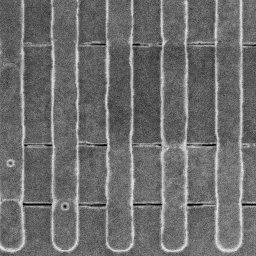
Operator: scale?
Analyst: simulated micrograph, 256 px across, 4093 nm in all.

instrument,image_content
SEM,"wiring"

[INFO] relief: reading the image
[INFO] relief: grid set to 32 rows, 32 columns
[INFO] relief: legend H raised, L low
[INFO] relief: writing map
HHHLLLLHHHLLLHHHLLLLHHHLLLLHHHLL
HHHLLLLHHHLLLHHHHLLLHHHLLLLHHHLL
HHHLLLLHHHLLLHHHHLLLHHHLLLLHHHLL
HHHLLLLHHHLLLHHHHLLLHHHLLLLHHHLL
HHHLLLLHHHLLLHHHLLLLHHHLLLLHHHLL
HHHLLLLHHHLLLHHHLLLLHHHLLLLHHHLL
HHHLLLLHHHLLLHHHLLLLHHHLLLLHHHLL
HHHLLLLHHHLLLHHHLLLLHHHLLLLHHHLL
HHHLLLLHHHLLLHHHLLLLHHHLLLLHHHLL
HHHLLLLHHHLLLHHHLLLLHHHLLLLHHHLL
HHHLLLLHHHLLLHHHLLLLHHHLLLLHHHLL
HHHLLLLHHHLLLHHHHLLLHHHLLLLHHHLL
HHHLLLLHHHLLLHHHHLLLHHHLLLLHHHLL
HHHLLLLHHHLLLHHHHLLLHHHLLLLHHHLL
HHHLLLLHHHLLLHHHHLLLHHHLLLLHHHLL
HHHLLLLHHHLLLHHHHLLLHHHLLLLHHHLL
HHHLLLLHHHLLLHHHLLLLHHHLLLLHHHLL
HHHLLLLHHHLLLHHHLLLLHHHLLLLHHHLL
HHHLLLLHHHLLLHHHLLLLLHHLLLLHHHLL
HHHLLLLHHHLLLHHHHLLLHHHLLLLHHHLL
HHHLLLLHHHLLLHHHHLLLHHHLLLLHHHLL
HHHLLLLHHHLLLHHHHLLLHHHLLLLHHHLL
HHHLLLLHHHLLLHHHHLLLHHHLLLLHHHLL
HHHLLLLHHHLLLHHHHLLLHHHLLLLHHHLL
HHHLLLLHHHLLLHHHHLLLHHHLLLLHHHLL
HHHLLLLHHHLLLHHHLLLLHHHLLLLHHHLL
HHHLLLLHHHLLLHHHHLLLHHHLLLLHHHLL
HHHLLLLHHHLLLHHHHLLLHHHLLLLHHHLL
HHHLLLLHHHLLLHHHHLLLHHHLLLLHHHLL
HHHLLLLHHHLLLHHHHLLLHHHLLLLHHHLL
HHHLLLLHHLLLLHHHHLLLHHHLLLLHHHLL
LLLLLLLLLLLLLLLLLLLLLLLLLLLLLLLL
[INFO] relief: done